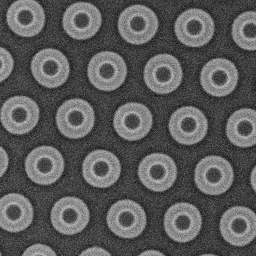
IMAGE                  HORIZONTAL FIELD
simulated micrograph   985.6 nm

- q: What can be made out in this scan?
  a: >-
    an array of small figures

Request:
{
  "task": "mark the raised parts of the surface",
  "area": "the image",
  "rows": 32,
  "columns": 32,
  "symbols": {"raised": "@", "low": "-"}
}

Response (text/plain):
--@@@----@@---------------------
-@@@@---@@@@---@@@@----@@@-----@
-@@@@@--@@@@@--@@@@@--@@@@@--@@@
-@@@@---@@@@---@@@@@--@@@@@--@@@
---@-----@@@---@@@@---@@@@---@@@
-----------------------@@@----@@
@----@@------@------------------
@@--@@@@---@@@@----@@@-----@----
@@--@@@@@--@@@@@--@@@@@--@@@@---
@---@@@@@--@@@@@--@@@@@--@@@@@--
-----@@@----@@@---@@@@---@@@@@--
-------------------@@-----@@@---
-@@@-----@----------------------
@@@@@--@@@@----@@@-----@--------
@@@@@--@@@@@--@@@@@--@@@@@---@@@
@@@@@--@@@@@--@@@@@--@@@@@--@@@@
-@@-----@@@----@@@@--@@@@@--@@@@
----------------@-----@@@----@@@
-----@@-------------------------
@--@@@@@---@@@----@@@-----@-----
@--@@@@@--@@@@@--@@@@@---@@@@---
@--@@@@@--@@@@@--@@@@@--@@@@@--@
----@@@----@@@@---@@@@--@@@@@--@
-------------------@@----@@@@---
-@@-----------------------------
@@@@---@@@@---@@@-----@@--------
@@@@--@@@@@---@@@@---@@@@---@@@@
@@@@--@@@@@--@@@@@---@@@@---@@@@
@@@----@@@----@@@@---@@@@---@@@@
---------------@@----@@@----@@@@
-----------------------------@@-
---@@@@---@@@-----@@------------